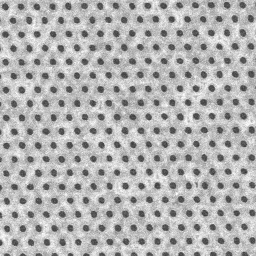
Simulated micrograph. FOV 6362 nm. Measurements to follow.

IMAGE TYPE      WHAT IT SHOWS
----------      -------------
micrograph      a regular array of holes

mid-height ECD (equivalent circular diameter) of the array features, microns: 0.179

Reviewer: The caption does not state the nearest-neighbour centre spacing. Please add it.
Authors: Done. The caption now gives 387 nanometres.